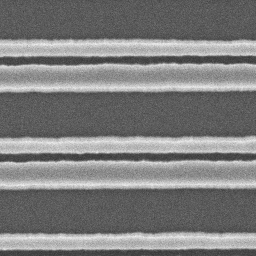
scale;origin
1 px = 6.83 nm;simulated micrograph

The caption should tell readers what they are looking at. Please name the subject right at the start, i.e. lines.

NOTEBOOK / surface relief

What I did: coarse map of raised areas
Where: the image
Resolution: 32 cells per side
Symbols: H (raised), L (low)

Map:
LLLLLLLLLLLLLLLLLLLLLLLLLLLLLLLL
LLLLLLLLLLLLLLLLLLLLLLLLLLLLLLLL
LLLLLLLLLLLLLLLLLLLLLLLLLLLLLLLL
LLLLLLLLLLLLLLLLLLLLLLLLLLLLLLLL
LLLLLLLLLLLLLLLLLLLLLLLLLLLLLLLL
HHHHHHHHHHHHHHHHHHHHHHHHHHHHHHHH
HHHHHHHHHHHHHHHHHHHHHHHHHHHHHHHH
HHHHHHHHHHHHHHHHHHHHHHHHHHHHHHHH
HHHHHHHHHHHHHHHHHHHHHHHHHHHHHHHH
HHHHHHHHHHHHHHHHHHHHHHHHHHHHHHHH
HHHHHHHHHHHHHHHHHHHHHHHHHHHHHHHH
LLLLLLLLLLLLLLLLLLLLLLLLLLLLLLLL
LLLLLLLLLLLLLLLLLLLLLLLLLLLLLLLL
LLLLLLLLLLLLLLLLLLLLLLLLLLLLLLLL
LLLLLLLLLLLLLLLLLLLLLLLLLLLLLLLL
LLLLLLLLLLLLLLLLLLLLLLLLLLLLLLLL
LLLLLLLLLLLLLLLLLLLLLLLLLLLLLLLL
LLLLLLLLLLLLLLLLLLLLLLLHLLLLLLLH
HHHHHHHHHHHHHHHHHHHHHHHHHHHHHHHH
HHHHHHHHHHHHHHHHHHHHHHHHHHHHHHHH
HHHHHHHHHHHHHHHHHHHHHHHHHHHHHHHH
HHHHHHHHHHHHHHHHHHHHHHHHHHHHHHHH
HHHHHHHHHHHHHHHHHHHHHHHHHHHHHHHH
LLLLLLLLLLLLLLLLLLLLLLLLLLLLLLLL
LLLLLLLLLLLLLLLLLLLLLLLLLLLLLLLL
LLLLLLLLLLLLLLLLLLLLLLLLLLLLLLLL
LLLLLLLLLLLLLLLLLLLLLLLLLLLLLLLL
LLLLLLLLLLLLLLLLLLLLLLLLLLLLLLLL
LLLLLLLLLLLLLLLLLLLLLLLLLLLLLLLL
LLLLLLLLLLLLLLLLLHLLLLHLLLLLLLLL
HHHHHHHHHHHHHHHHHHHHHHHHHHHHHHHH
HHHHHHHHHHHHHHHHHHHHHHHHHHHHHHHH